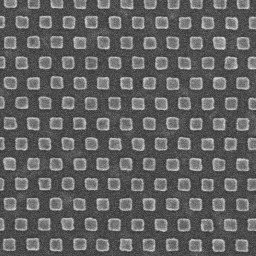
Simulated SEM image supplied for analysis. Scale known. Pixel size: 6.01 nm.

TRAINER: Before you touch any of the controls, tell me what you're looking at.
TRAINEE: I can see a regular array of raised bodies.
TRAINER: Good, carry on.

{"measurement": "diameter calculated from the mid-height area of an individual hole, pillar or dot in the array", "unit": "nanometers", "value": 79.2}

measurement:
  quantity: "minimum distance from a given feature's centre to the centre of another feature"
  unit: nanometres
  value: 138